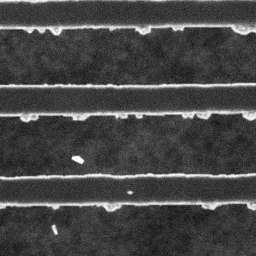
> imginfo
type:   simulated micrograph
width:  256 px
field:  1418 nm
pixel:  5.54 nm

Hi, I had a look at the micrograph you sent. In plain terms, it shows lines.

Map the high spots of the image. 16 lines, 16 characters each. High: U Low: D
UUUUUUUUUUUUUUUU
UUUUUUUUUUUUUUUU
DDDDDDDDDDDDDDDD
DDDDDDDDDDDDDDDD
DDDDDDDDDDDDDDDD
UUUUUUUUUUUUUUUU
UUUUUUUUUUUUUUUU
DDDDDDDDDDDDDDDD
DDDDDDDDDDDDDDDD
DDDDDDDDDDDDDDDD
DDDDDDDDDDDDDDDD
UUUUUUUUUUUUUUUU
UUUUUUUUUUUUUUUU
DDDDDDDDDDDDDDDD
DDDDDDDDDDDDDDDD
DDDDDDDDDDDDDDDD